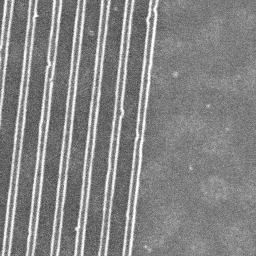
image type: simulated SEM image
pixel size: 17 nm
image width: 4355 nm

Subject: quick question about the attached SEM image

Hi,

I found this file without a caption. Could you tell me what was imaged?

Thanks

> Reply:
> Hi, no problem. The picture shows parallel lines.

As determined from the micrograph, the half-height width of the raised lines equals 106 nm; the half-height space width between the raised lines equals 302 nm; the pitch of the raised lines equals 408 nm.